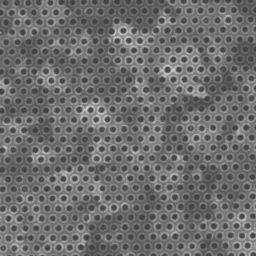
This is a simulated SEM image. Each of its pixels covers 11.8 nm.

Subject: a regular array of holes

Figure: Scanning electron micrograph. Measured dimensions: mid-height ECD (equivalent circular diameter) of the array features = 80.1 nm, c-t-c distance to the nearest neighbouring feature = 0.129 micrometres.